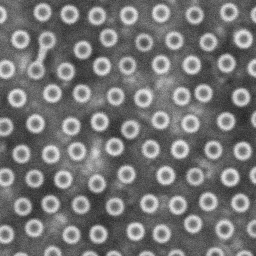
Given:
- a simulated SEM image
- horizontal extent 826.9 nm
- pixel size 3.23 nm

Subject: a regular array of raised bodies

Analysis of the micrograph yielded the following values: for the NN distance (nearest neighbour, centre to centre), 89.2 nanometers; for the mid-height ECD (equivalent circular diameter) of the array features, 49.7 nm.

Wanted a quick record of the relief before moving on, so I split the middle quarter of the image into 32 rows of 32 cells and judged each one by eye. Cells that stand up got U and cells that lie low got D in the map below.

UUDDDDDDUUUDDDUUUUDDDDUUUUDDDDUU
UUDDDDDDUUUDDDUUUDDDDDDUUUDDDDDU
UUDDDDDDDDDDDDDDDDDDDDDDDDDDDDDD
UUDDDDDDDDDDDDDDDDDDDDDDDDDDDDDD
DDDDDDDDDDDDDDDDDDDDDDDDDDDDDDDD
DDDDDDDDDDDDDDDDDDDDDDDDDDDDDDDD
DDDUUUDDDDDDUUDDDDDDDDDDDDDDUUDD
DDDUUUDDDDDUUUUDDDUUUDDDDDDDUUUD
DDDUUUDDDDDUUUUDDDUUUUDDDDDDUUUD
DDDDDDDDDDDDUUDDDDUUUDDDDDDDUUUD
DDDDDDDDDDDDDDDDDDDDDDDDDDDDDDDD
DDDDDDDDDDDDDDDDDDDDDDDDDDDDDDDD
DDDDDDDDDDDDDDDDDDDDDDDUUDDDDDDD
DDDDDDDUUUDDDDDDDDDDDDUUUUDDDDUU
UUUDDDDUUUUDDDDDDDDDDDUUUUDDDDUU
UUUUDDDUUUUDDDDUUUDDDDDUUDDDDDUU
UUUUDDDDDDDDDDDUUUDDDDDDDDDDDDUU
DDDDDDDDDDDDDDDUUUDDDDDDDDDDDDDD
DDDDDDDDDDDDDDDDDDDDDDDDDDDDDDDD
DDDDDDDDDDDUUUDDDDDDDUDDDDDDDDDD
DDUUUDDDDDDUUUDDDDDDUUUDDDDUUUDD
DDUUUDDDDDDUUUDDDDDDUUUUDDDUUUUD
DDUUUDDDDDDDDDDDDDDDUUUDDDDUUUUD
DDUUDDDDDDDDDDDDDDDDDDDDDDDDDDDD
DDDDDDDDDDDDDDDDDDDDDDDDDDDDDDDD
DDDDDDDDDDDDDDDDDDDDDDDDDDDDDDDD
DDDDDDDDDDDDDDUUUDDDDDDDUUUDDDDD
UDDDDDDDDDDDDDUUUUDDDDDDUUUDDDDU
UUDDDDDUUDDDDDUUUDDDDDDDUUUDDDDU
UUDDDDUUUUDDDDDDDDDDDDDDUUUDDDDU
UDDDDDUUUUDDDDDDDDDDDDDDDDDDDDDD
DDDDDDDUUDDDDDDDDDDDDDDDDDDDDDDD